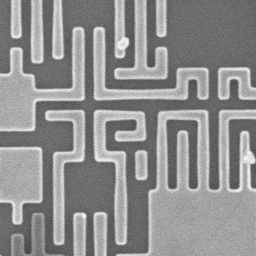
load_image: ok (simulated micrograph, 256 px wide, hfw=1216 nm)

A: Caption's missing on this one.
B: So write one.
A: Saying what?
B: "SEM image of wiring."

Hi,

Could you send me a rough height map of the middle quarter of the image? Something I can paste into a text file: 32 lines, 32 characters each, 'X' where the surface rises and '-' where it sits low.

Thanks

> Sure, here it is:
--XXX---XX--------XXX--XXX------
--XXX---XX---XXXXXXXXXXXXX--XXXX
--XXX---XX---XXXXXXXXXXXXX--XXXX
--XXX---XX---XXXXXXXXXXXX---XXXX
--XXX---XX------------------XXX-
--XXX---XX------------------XXX-
XXXXX---XXX--------------XXXXXX-
XXXXX---XXXXXXXXXXXXXXXXXXXXXXX-
XXXXX---XXXXXXXXXXX--XXXXXXXXXX-
--------------------------------
--------------------------------
--------------------------------
XXXXX---XXXXXXXXXXXX----XXXXXXXX
XXXXX---XXXXXXXXXXXX----XXXXXXXX
--XXX---XX--------XX----XX------
---XX---XX--------XX---XX-------
---XX---XX--------XX---XX-------
---XX---XX---XXXXXXX---XXX--XXX-
---XX---XX---XXXXXXX---XXX--XXX-
---XX---XX-------------XXX--XXX-
---XX---XX-------------XXX--XXX-
--XXX---XXX------------XXX--XXX-
XXXXX---XXXXXXX---XXX--XXX--XXX-
XXXXX---XXXXXXX---XXX--XXX--XXX-
X-----------XXX---XXX--XXX--XXX-
-------------XX---XXX--XXX--XXX-
-------------XX---XXX--XXX--XXX-
-------------XX---XXX--XXX--XXX-
-------------XX---XXX--XXX--XXX-
-------------XX--------XXX--XXX-
-------------XX--------XXX--XXX-
-------------XX-------XXXXXXXXXX